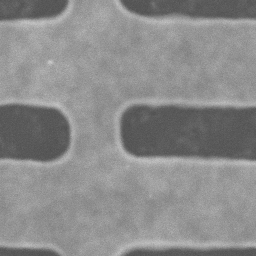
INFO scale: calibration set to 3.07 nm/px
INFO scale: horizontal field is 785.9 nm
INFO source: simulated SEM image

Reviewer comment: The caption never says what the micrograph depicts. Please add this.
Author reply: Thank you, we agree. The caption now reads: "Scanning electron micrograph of holes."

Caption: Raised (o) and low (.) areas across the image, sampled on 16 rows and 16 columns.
....oooo........
oooooooooooooooo
oooooooooooooooo
oooooooooooooooo
oooooooooooooooo
oooooooooooooooo
oooooooooooooooo
....oooo........
....oooo........
....oooo........
oooooooooooooooo
oooooooooooooooo
oooooooooooooooo
oooooooooooooooo
oooooooooooooooo
.ooooooooo......